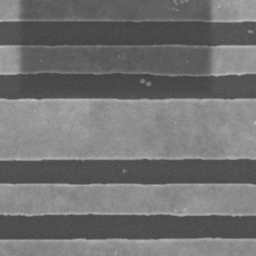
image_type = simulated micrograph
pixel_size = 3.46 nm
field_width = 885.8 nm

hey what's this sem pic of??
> lines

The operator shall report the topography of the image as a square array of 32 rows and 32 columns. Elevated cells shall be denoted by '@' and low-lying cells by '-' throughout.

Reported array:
@@@@@@@@@@@@@@@@@@@@@@@@@@@@@@@@
@@@@@@@@@@@@@@@@@@@@@@@@@@@@@@@@
@@@@@@@@@@@@@@@@@@@@@@@@@@@@@@@@
--------------------------------
--------------------------------
--------------------------------
@@@@@@@@@@@@@@@@@@@@@@@@@@@@@@@@
@@@@@@@@@@@@@@@@@@@@@@@@@@@@@@@@
@@@@@@@@@@@@@@@@@@@@@@@@@@@@@@@@
--------------------------------
--------------------------------
--------------------------------
@-@@@@@@@@@@@@@---------@-@@-@@@
@@@@@@@@@@@@@@@@@@@@@@@@@@@@@@@@
@@@@@@@@@@@@@@@@@@@@@@@@@@@@@@@@
@@@@@@@@@@@@@@@@@@@@@@@@@@@@@@@@
@@@@@@@@@@@@@@@@@@@@@@@@@@@@@@@@
@@@@@@@@@@@@@@@@@@@@@@@@@@@@@@@@
@@@@@@@@@@@@@@@@@@@@@@@@@@@@@@@@
@@@@@@@@@@@@@@@@@@@@@@@@@@@@@@@@
--------------------------------
--------------------------------
--------------------------------
@@@@@@@@@@@@@@@@@@@@@@@@@@@@@@@@
@@@@@@@@@@@@@@@@@@@@@@@@@@@@@@@@
@@@@@@@@@@@@@@@@@@@@@@@@@@@@@@@@
@@@@@@@@@@@@@@@@@@@@@@@@@@@@@@@@
--------------------------------
--------------------------------
--------------------------------
@@@@@@@@@@@@@@@@@@@@@@@@@@@@@@@@
@@@@@@@@@@@@@@@@@@@@@@@@@@@@@@@@